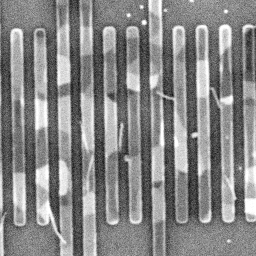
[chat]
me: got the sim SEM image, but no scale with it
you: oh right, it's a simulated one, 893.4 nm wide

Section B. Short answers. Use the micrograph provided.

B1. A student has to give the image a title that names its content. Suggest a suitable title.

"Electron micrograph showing groups of lines, slits or small figures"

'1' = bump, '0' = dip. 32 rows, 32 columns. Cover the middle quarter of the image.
10001110001110001110001100001100
10001110001110001110001100001100
10001110001110001110001100001100
10001110001110001110001100001100
10001110001110001110001100001100
10001110001110001110001100001100
10001110001110001110001100001100
10001110001110001110001110001100
10001110001110001110001100011100
11001110000110001110001100001100
11001110000110001110001100001100
11001110000110001110001100001100
11000110000110001110001100001100
11000110000110001110001100001100
11000110000110001110001100001100
11001110000110001110001100001100
11001110000110001110001110001100
11000110000110001110001110001100
11000110000110001110001110001100
11000110000110001110001110001100
11000110000110001110001110001100
11000110000110001110001110001100
11000110000110001110001110001100
11000110000110001110001110001110
11000110000110001110001110001110
11000111000110001110001110001110
11000111000110001110001110001110
11000111000110001110001110001110
11000111000110001110001110001110
11000111000110001110001110001110
11000111000110000110001110001110
11000111000110000110001110001110